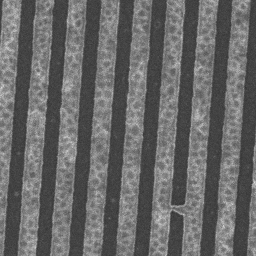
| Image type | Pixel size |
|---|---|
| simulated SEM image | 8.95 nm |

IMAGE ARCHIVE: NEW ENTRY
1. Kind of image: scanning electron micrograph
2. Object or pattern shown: parallel lines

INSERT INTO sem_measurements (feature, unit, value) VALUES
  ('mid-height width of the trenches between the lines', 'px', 15.5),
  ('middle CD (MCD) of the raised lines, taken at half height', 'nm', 156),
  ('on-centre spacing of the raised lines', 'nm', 292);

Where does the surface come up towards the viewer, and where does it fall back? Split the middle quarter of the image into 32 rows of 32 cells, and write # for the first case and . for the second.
####....#####....####....####...
####....####.....####....####...
####....####....####.....####...
####....####....####....#####...
####....####....####.....####...
####....####....####....#####...
####....####....####....#####...
####....####....####....####....
####....####....####....####....
####....####....####....####....
####....####....####....####....
###.....####....####....####....
###.....####....####....####....
###....#####....####....####....
###....#####....#.##....####....
###....####.....####....####....
###....####.....####....####....
###....####....#####...#####....
###....####....#####....####....
###....####....####.....###.....
###....####....####....#####...#
###....####....####....####....#
###....####....####....####....#
###....####....####....####....#
###....####....####....####....#
##.....####....####....####....#
##.....####....####....####....#
##....#####....####....####....#
##....#####....####....####....#
##....####.....####....####....#
##....####....####.....####....#
##....####....#####...#####....#